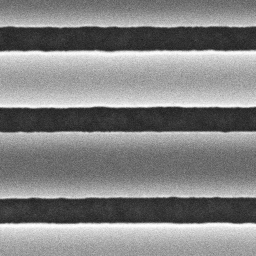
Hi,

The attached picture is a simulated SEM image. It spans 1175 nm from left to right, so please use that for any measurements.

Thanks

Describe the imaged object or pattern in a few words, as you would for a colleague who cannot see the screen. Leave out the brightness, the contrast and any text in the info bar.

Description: lines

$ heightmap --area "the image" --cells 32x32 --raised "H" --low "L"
HHHHHHHHHHHHHHHHHHHHHHHHHHHHHHHH
HHHHHHHHHHHHHHHHHHHHHHHHHHHHHHHH
HHHHHHHHHHHHHHHHHHHHHHHHHHHHHHHH
LLLLLLLLLLLLLLLLLLLLLLLLLLLLLLLL
LLLLLLLLLLLLLLLLLLLLLLLLLLLLLLLL
LLLLLLLLLLLLLLLLLLLLLLLLLLLLLLLL
LLHHHHLHHHHHHLHHHHHHHHHHHHHHHHHH
HHHHHHHHHHHHHHHHHHHHHHHHHHHHHHHH
HHHHHHHHHHHHHHHHHHHHHHHHHHHHHHHH
HHHHHHHHHHHHHHHHHHHHHHHHHHHHHHHH
HHHHHHHHHHHHHHHHHHHHHHHHHHHHHHHH
HHHHHHHHHHHHHHHHHHHHHHHHHHHHHHHH
HHHHHHHHHHHHHHHHHHHHHHHHHHHHHHHH
LLLLLLLLLLLLLLLLLLLLLLLLLLLLLLLL
LLLLLLLLLLLLLLLLLLLLLLLLLLLLLLLL
LLLLLLLLLLLLLLLLLLLLLLLLLLLLLLLL
LLLLLLLLLLLLLLLLLLLLLLLLLLLLLLLL
HHHHHHHHHHHHHHHHHHHHHHHHHHHHHHHH
HHHHHHHHHHHHHHHHHHHHHHHHHHHHHHHH
HHHHHHHHHHHHHHHHHHHHHHHHHHHHHHHH
HHHHHHHHHHHHHHHHHHHHHHHHHHHHHHHH
HHHHHHHHHHHHHHHHHHHHHHHHHHHHHHHH
HHHHHHHHHHHHHHHHHHHHHHHHHHHHHHHH
HHHHHHHHHHHHHHHHHHHHHHHHHHHHHHHH
HHHHHHHHHHHHHHHHHHHHHHHHHHHHHHHH
LLLLLLLLLLLLLLLLLLLLLLLLLLLLLLLL
LLLLLLLLLLLLLLLLLLLLLLLLLLLLLLLL
LLLLLLLLLLLLLLLLLLLLLLLLLLLLLLLL
HHHHHHHHHHHHHHHHHHHHHHHHHHHHHHHH
HHHHHHHHHHHHHHHHHHHHHHHHHHHHHHHH
HHHHHHHHHHHHHHHHHHHHHHHHHHHHHHHH
HHHHHHHHHHHHHHHHHHHHHHHHHHHHHHHH